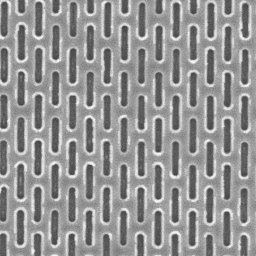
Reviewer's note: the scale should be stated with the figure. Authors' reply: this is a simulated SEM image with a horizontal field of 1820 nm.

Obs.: a regular array of holes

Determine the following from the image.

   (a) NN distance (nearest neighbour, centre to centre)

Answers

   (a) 201 nanometers